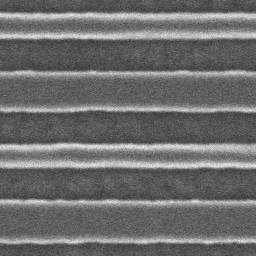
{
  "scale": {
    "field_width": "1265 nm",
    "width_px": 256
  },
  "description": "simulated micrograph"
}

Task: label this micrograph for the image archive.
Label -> lines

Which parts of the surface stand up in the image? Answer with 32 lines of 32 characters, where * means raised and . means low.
................................
................................
********************************
********************************
********************************
................................
................................
................................
................................
********************************
********************************
********************************
********************************
********************************
................................
................................
................................
................................
********************************
********************************
********************************
................................
................................
................................
................................
********************************
********************************
********************************
********************************
********************************
................................
................................